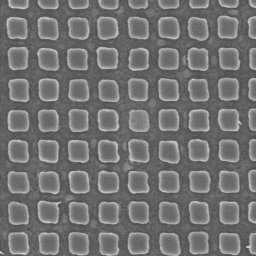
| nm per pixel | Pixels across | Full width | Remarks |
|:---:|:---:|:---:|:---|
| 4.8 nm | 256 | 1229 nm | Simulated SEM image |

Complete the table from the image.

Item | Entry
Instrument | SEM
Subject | a regular array of raised bodies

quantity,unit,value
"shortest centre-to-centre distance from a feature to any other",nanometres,143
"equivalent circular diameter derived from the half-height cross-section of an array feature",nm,108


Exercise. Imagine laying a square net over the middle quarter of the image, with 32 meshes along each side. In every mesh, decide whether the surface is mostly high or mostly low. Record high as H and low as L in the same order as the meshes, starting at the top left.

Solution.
LHHHHHLLLHHHHLLLHHHHHLLLHHHHLLLH
LLLLHLLLLLLLLLLLLLLLLLLLLLLLLLLL
LLLLLLLLLLLLLLLLLLLLLLLLLLLLLLHL
LLLLLLLLLLLLLLLLLLLLLLLLLLLLLLLL
LLHHHHLLLHHHHLLLHHHHHLLLHHHHLLLH
LHHHHHLLLHHHHLLLHHHHHLLLHHHHLLLH
LHHHHHLLLHHHHHLLHHHHHLLLHHHHLLLH
LHHHHHLLLHHHHHLLHHHHHLLLHHHHLLLH
LHHHHHLLLHHHHHLLLHHHHLLLHHHHHLLL
LLLLLLLLLLLLLLLLLLLLLLLLLLLLLLLL
LLLLLLLLLLLLLLLLLLLLLLLLLLLLLLLL
LLHHHLLLLHHLLLLLLLLLLLLLHLHHLLLL
LHHHHHLLLHHHHLLLLLHHLLLLHHHHLLLH
LHHHHHLLLHHHHLLLLHHHLLLLHHHHHLLH
LHHHHHLLLHHHHLLLLHLLHLLLHHHHHLLH
LHHHHHLLLHHHHHLLLHHHLLLLHHHHLLLH
LLHHHHLLLLHHLLLLLHHHHLLLLHHHLLLL
LLLLLLLLLLLLLLLLLLLLLLLLLLLLLLLL
LLLLLLLLLLLLLLLLLLLLLLLLLLLLLLLL
LHHHHHLLLHHHLLLLHHHHHLLLHHHHLLLH
LHHHHHLLLHHHHLLLHHHHHLLLHHHHLLLH
LHHHHHLLLHHHHLLLHHHHHLLLHHHHHLLH
LHHHHHLLLHHHHLLLLHHHHLLLHHHHHLLH
LHHHHHLLLHHHHHLLHHHHHLLLHHHHHLLH
LLLLHLLLLLLLLLLLLLLLLLLLLLHHHLLL
LLLLLLLLLLLLLLLLLLLLLLLLLLLLLLLL
LLLLLLLLLLLLLLLLLLLLLLLLLLLLLLLL
LHHHHHLLLHHHHLLLHHHHHLLLHHHHHLLH
LHHHHHLLLHHHHHLLHHHHHLLLHHHHHLLH
LLHHHHLLLHHHHHLLHHHHHLLLHHHHHLLL
LLHHHHLLLHHHHHLLHHHHHLLLHHHHHLLL
LLHHHHLLLHHHHHLLHHHHHLLLHHHHHLLL